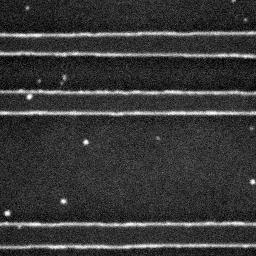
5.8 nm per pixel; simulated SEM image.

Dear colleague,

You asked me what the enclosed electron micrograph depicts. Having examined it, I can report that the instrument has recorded lines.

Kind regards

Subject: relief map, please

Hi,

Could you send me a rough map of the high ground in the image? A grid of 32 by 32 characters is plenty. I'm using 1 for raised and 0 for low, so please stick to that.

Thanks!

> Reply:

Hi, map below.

00000000000000000000000000000000
00000000000000000000000000000000
00000000000000000000000000000000
00000000000000000000000000000000
11111111111111111111111111111111
11111111111111111111111111111111
11111111111111111111111111111111
00000000000000000000000000000000
00000000000000000000000000000000
00000000000000000000000000000000
00000000000000000000000000000000
11111111101011101100111000000100
11111111111111111111111111111111
11111111111111111111111111111111
00000000000000000000000000000000
00000000000000000000000000000000
00000000000000000000000000000000
00000000000000000000000000000000
00000000000000000000000000000000
00000000000000000000000000000000
00000000000000000000000000000000
00000000000000000000000000000000
00000000000000000000000000000000
00000000000000000000000000000000
00000000000000000000000000000000
00000000000000000000000000000000
00000000000000000000000000000000
00000000000000000000000000000000
11111111111111111111111111111111
11111111111111111111111111111111
11111111111111111111111111111111
00000000000000000000000000000000